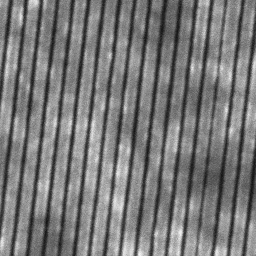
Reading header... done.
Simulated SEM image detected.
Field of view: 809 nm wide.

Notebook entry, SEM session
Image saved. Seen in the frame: parallel lines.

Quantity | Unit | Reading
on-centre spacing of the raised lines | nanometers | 48.4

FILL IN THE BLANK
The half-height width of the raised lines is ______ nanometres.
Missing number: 34.5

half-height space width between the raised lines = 14.5 nm